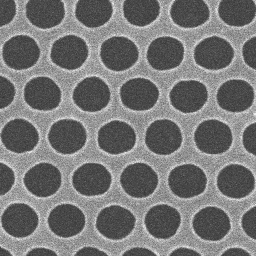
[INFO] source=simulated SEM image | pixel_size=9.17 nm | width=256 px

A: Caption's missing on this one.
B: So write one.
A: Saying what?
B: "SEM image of a regular array of holes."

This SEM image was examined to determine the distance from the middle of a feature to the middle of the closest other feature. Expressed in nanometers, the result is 428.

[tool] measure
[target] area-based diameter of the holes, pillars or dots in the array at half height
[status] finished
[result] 331 nm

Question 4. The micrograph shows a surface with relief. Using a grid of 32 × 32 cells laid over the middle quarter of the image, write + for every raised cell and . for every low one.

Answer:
....++++++.......+++++.......+++
+.++++++++++....+++++++...++++++
++++++++++++++++++++++++++++++++
++++++...++++++++...++++++++++++
++++......+++++.......+++++++...
+++........+++.........+++++....
++.........+++..........+++.....
++..........++..........++......
++..........++..........+++.....
+++........++++........++++.....
+++.......+++++.......+++++.....
+++++....++++++++....+++++++....
++++++++++++++++++++++++++++++++
++++++++++++++++++++++++++++++++
...++++++++....+++++++.....+++++
.....+++++.......++++.......++++
.....++++........++++........+++
......++..........++.........+++
......++..........++..........++
.....++++.........++.........+++
.....++++.........+++........+++
....++++++.......+++++......++++
.+++++++++++.++++++++++....+++++
++++++++++++++++++++++++++++++++
++++++++++++++++++.+++++++++++++
++++......++++++.....++++++++...
+++........++++.......+++++.....
++.........+++.........+++......
++..........++..........++......
++..........++..........++......
++.........+++.........+++......
+++........++++........++++.....